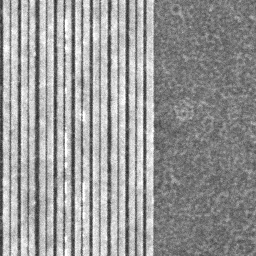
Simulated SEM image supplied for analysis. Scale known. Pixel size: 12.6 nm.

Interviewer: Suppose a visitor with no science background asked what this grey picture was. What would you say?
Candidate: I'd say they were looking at parallel lines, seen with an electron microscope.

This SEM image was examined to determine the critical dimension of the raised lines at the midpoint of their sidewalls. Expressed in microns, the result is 0.074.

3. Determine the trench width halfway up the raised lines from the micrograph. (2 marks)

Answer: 53.6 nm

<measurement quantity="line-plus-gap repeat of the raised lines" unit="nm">113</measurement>